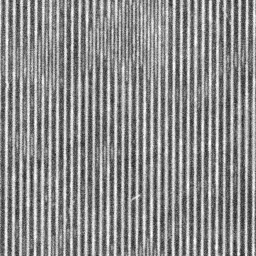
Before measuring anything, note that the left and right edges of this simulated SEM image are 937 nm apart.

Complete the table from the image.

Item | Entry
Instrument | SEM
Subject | parallel lines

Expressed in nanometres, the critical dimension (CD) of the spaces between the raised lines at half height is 18.8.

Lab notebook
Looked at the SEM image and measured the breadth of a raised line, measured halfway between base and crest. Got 7.8 nanometres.